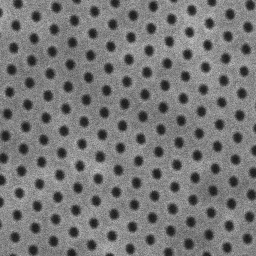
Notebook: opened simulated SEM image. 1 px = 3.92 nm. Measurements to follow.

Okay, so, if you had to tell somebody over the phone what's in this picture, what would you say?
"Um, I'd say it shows a regular array of holes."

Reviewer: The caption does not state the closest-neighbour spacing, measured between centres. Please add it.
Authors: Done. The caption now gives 0.0863 um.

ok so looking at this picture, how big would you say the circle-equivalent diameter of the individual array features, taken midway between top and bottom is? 39 nm